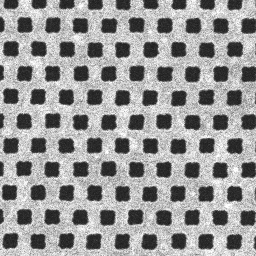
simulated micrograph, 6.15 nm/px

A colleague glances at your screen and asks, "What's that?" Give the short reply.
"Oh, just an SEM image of a regular array of holes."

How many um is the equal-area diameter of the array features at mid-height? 0.101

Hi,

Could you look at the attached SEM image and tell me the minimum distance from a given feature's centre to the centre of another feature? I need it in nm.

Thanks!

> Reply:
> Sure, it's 168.